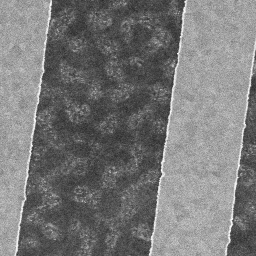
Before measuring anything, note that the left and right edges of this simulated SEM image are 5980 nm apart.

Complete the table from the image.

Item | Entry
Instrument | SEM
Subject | one or a few lines or trenches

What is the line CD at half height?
1760 nanometres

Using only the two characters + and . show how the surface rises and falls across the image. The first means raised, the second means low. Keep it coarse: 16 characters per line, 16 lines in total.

+++.........++++
+++........+++++
+++........+++++
+++........+++++
+++........+++++
+++........+++++
++.........++++.
++.........++++.
++........+++++.
++........+++++.
++........+++++.
++........+++++.
++........+++++.
+.........+++++.
+.........++++..
+........+++++..